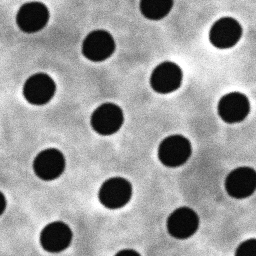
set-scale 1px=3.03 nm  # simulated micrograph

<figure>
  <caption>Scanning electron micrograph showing a regular array of holes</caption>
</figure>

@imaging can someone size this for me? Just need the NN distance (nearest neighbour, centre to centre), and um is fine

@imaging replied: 0.219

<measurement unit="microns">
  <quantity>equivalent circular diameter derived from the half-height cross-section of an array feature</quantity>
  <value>0.0984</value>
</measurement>